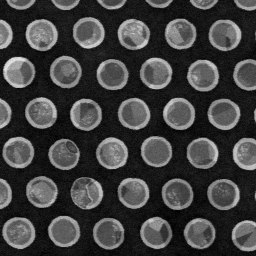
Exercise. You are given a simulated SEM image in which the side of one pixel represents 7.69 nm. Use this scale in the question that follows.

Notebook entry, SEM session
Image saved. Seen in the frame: a regular array of raised bodies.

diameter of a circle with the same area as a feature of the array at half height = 220 nm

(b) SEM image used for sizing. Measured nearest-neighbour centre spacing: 340 nm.